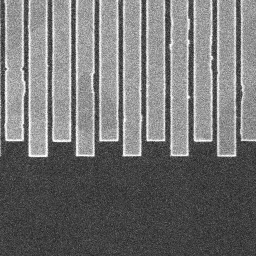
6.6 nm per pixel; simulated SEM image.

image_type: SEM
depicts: parallel lines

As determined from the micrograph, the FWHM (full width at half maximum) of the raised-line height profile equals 120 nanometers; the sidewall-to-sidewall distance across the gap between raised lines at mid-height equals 33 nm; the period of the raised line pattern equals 156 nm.